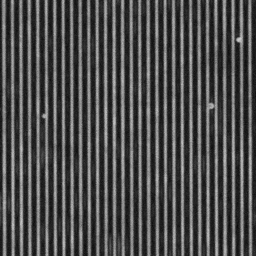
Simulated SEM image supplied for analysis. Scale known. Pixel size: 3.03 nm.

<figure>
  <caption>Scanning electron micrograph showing parallel lines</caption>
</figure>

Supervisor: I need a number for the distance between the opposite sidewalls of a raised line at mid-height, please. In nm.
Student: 6.4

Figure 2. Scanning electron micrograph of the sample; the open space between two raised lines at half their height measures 18.9 nm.